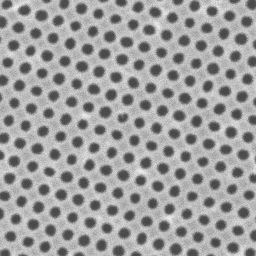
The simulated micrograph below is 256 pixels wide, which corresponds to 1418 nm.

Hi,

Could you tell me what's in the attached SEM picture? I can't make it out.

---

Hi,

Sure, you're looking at a regular array of holes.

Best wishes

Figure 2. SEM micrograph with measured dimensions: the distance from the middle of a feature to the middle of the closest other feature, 98.2 nm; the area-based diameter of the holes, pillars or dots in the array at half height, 63.7 nanometres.